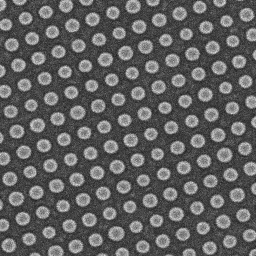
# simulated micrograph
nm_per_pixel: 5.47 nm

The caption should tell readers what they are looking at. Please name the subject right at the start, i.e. a regular array of raised bodies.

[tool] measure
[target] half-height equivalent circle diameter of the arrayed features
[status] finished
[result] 69.6 nanometres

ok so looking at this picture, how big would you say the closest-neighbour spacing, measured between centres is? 114 nanometres